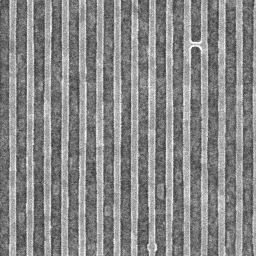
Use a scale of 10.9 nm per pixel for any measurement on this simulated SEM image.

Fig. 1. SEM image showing parallel lines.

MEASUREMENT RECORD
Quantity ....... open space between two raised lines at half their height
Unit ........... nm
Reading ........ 127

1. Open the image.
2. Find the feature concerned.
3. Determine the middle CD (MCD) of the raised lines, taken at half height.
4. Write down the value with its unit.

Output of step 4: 68.2 nm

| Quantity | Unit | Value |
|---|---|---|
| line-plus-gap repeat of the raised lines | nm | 190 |